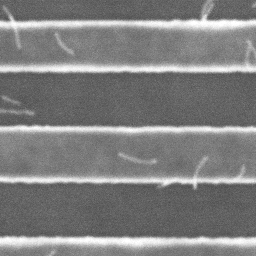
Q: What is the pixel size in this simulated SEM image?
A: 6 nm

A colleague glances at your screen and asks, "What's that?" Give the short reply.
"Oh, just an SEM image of lines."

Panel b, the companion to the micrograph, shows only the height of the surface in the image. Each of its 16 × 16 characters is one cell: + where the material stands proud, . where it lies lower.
................
++++++++++++++++
++++++++++++++++
++++++++++++++++
................
................
................
................
++++++++++++++++
++++++++++++++++
++++++++++++++++
................
................
................
................
++++++++++++++++